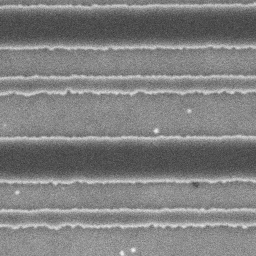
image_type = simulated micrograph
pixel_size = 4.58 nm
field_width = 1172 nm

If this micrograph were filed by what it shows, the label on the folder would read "lines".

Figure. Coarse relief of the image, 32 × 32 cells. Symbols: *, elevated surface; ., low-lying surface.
...............................*
********************************
********************************
********************************
********************************
********************************
................................
................................
................................
....*....**.....**.**..*.*****..
********************************
********.********.*************.
................................
................................
................................
................................
................................
********************************
********************************
********************************
********************************
********************************
********************************
................................
................................
................................
********************************
********************************
......*.........................
................................
................................
................................